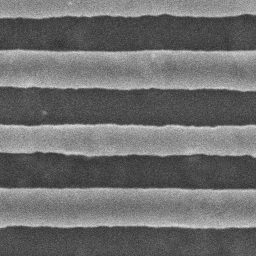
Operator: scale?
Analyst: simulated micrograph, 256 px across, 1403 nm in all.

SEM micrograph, lines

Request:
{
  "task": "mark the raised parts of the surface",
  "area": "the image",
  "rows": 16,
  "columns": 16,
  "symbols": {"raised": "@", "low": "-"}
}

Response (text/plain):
@@@@@@@@@@@@@@@@
----------------
----------------
@@@@@@@@@@@@@@@@
@@@@@@@@@@@@@@@@
----@-@@@-@@@@@@
----------------
----------------
@@@@@@@@@@@@@@@@
@@-@@@@@@@@@@@@@
----------------
----------------
@@@@@@@@@@@@@@@@
@@@@@@@@@@@@@@@@
----------------
----------------